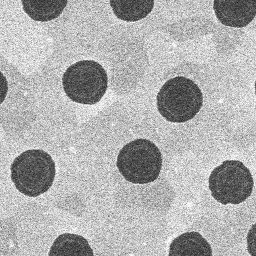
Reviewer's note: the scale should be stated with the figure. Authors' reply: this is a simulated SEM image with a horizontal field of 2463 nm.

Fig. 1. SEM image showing ring-shaped grooves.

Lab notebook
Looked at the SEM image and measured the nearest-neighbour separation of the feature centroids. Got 812 nanometres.